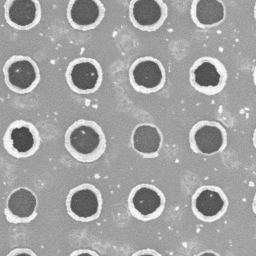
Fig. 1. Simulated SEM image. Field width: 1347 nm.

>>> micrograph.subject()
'a regular array of holes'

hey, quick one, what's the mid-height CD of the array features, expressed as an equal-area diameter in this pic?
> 151 nm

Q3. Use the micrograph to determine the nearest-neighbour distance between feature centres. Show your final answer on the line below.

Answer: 327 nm